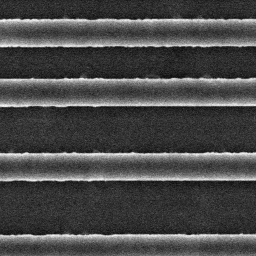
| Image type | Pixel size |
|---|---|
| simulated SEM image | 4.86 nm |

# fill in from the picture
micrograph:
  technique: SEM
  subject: lines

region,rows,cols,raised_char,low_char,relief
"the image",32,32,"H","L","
LLLLLLLLLLLLLLLLLLLLLLLLLLLLLLLL
LLLLLLLLLLLLLLLLLLLLLLLLLLLLLLLL
HHHHHHHHHHHLHHHHLLHHHHHHHHHHHHHH
HHHHHHHHHHHHHHHHHHHHHHHHHHHHHHHH
HHHHHHHHHHHHHHHHHHHHHHHHHHHHHHHH
HHHHHHHHHHHHHHHHHHHHHHHHHHHHHHHH
LLLLLLLLLLLLLLLLLLLLLLLLLLLLLLLL
LLLLLLLLLLLLLLLLLLLLLLLLLLLLLLLL
LLLLLLLLLLLLLLLLLLLLLLLLLLLLLLLL
LLLLLLLLLLLLLLLLLLLLLLLLLLLLLLLL
HHHHHHHHHHHHHHHHHHHHHHHHHHHHHHHH
HHHHHHHHHHHHHHHHHHHHHHHHHHHHHHHH
HHHHHHHHHHHHHHHHHHHHHHHHHHHHHHHH
LLLLLLLLLLLLLLLLLLLLLLLLLLLLLLLL
LLLLLLLLLLLLLLLLLLLLLLLLLLLLLLLL
LLLLLLLLLLLLLLLLLLLLLLLLLLLLLLLL
LLLLLLLLLLLLLLLLLLLLLLLLLLLLLLLL
LLLLLLLLLLLLLLLLLLLLLLLLLLLLLLLL
LLLLLLLLLLLLLLLLLLLLLLLLLLLLLLLL
HHHHHHHHHHHHHHHHHHHHHHHHHHHHHHHH
HHHHHHHHHHHHHHHHHHHHHHHHHHHHHHHH
HHHHHHHHHHHHHHHHHHHHHHHHHHHHHHHH
LHLHHLLHLLLHLLLLLLLLLLLLLLLLLLLL
LLLLLLLLLLLLLLLLLLLLLLLLLLLLLLLL
LLLLLLLLLLLLLLLLLLLLLLLLLLLLLLLL
LLLLLLLLLLLLLLLLLLLLLLLLLLLLLLLL
LLLLLLLLLLLLLLLLLLLLLLLLLLLLLLLL
LLLLLLLLLLLLLLLLLLLLLLLLLLLLLLLL
LLLLLLLLLLLLLLLLLLLLLLLLLLLLLLLL
HHHHHHHHHHHHHHHHHHHHHHHHHHHHHHHH
HHHHHHHHHHHHHHHHHHHHHHHHHHHHHHHH
HHHHHHHHHHHHHHHHHHHHHHHHHHHHHHHH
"